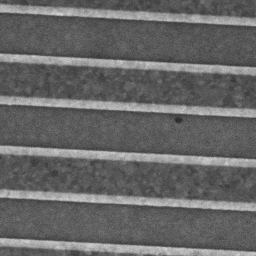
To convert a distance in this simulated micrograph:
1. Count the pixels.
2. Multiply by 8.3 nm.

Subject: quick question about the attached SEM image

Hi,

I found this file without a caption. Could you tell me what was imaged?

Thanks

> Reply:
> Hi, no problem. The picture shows one or a few lines or trenches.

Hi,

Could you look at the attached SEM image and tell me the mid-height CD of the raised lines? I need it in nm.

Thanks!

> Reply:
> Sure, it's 368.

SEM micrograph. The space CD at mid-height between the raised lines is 0.393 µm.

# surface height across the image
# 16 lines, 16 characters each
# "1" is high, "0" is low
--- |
1111111111111111
0000000000000000
0000000000000000
0000000000000000
1111111111111111
1111111111111111
0000111111111111
0000000000000000
0000000000000000
1110000000000000
1111111111111111
1111111111111111
0000001111111111
0000000000000000
0000000000000000
1111111100000000